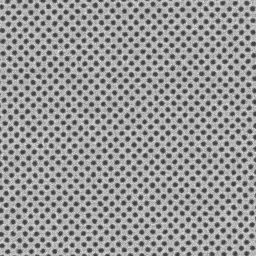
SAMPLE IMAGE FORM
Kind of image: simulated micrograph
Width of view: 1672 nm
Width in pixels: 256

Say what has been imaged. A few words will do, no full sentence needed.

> a regular array of holes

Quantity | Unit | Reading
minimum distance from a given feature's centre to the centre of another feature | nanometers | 51.4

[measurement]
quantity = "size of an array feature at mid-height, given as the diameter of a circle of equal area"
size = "32.9 nm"